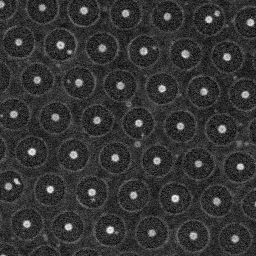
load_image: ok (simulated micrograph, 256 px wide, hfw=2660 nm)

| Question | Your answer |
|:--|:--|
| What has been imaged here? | an array of small figures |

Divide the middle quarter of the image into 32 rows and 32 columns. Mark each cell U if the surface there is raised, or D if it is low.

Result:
UUUUUUUUUUUUUUUUUUUDDDUUUUUUDDDD
UDDDDDUUUUUUUDUUUUUUUUUUUUUUUUDU
DDDDDDDUUUUDDDDDDUUUUUUDDDUUUUUU
DDDDDDDUUUDDDDDDDDUUUDDDDDDUUUUU
DDDUDDDDUUDDDDDDDDUUUDDDDDDDUUUU
DDDDDDDDUUDDDUUDDDUUDDDDDDDDUUUD
DDDDDDDUUUDDDDDDDDUUUDDDUDDDDUUD
UDDDDDDUUUUDDDDDDDUUUDDDDDDDUUUD
UUUDDUUUUUUUDDDDDUUUUDDDDDDDUUUD
UUUUUUUUUUUUUUUUUUUUUUDDDDDUUUUU
UUUUUUUDDUUUUUUUUUUUUUUUUUUUUUUU
DUUUUDDDDDDUUUUUUDDDDUUUUUUUUUUU
DDUUUDDDDDDDUUUDDDDDDDUUUUUDDDDD
DDUUDDDDUDDDUUUDDDDDDDUUUUDDDDDD
DDUUDDDDUDDDUUUDDDUDDDDUUDDDDDDD
DUUUUDDDDDDDUUUDDDDDDDUUUDDDUUDD
UUUUUDDDDDDUUUUDDDDDDDUUUDDDDDDD
UUUUUUDDDDUUUUUUDDDDDUUUUUDDDDDD
UUUUUUUUUUUUUUUUUDDDUUUUUUUDDDDD
DDDDDUUUUUUUUUUUUUUUUUUUUUUUUDUU
DDDDDDUUUUDDDDDUUUUUUUDDUUUUUUUU
DDDDDDUUUDDDDDDDUUUUUDDDDDUUUUUU
DDUDDDUUUDDDDDDDUUUUDDDDDDDUUUUD
DDDDDDUUUDDDUDDDDUUUDDDDDDDUUUDD
DDDDDDUUUDDDDDDDDUUDDDDUDDDUUUDD
DDDDDUUUUDDDDDDDUUUUDDDDDDDUUUDD
UDDDUUUUUUDDDDDUUUUUDDDDDDUUUUDD
UUUUUUUUUUUUUUUUUUUUUDDDDDUUUUUD
UUUUUDDDDUUUUUUUUUUUUUUUUUUUUUUU
UUUUDDDDDDUUUUUUDDDDUUUUUUUUUUUU
UUUDDDDDDDDUUUDDDDDDDUUUUDDDDDUU
DUUDDDDDDDDUUUDDDDDDDUUUDDDDDDDU